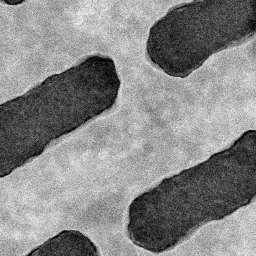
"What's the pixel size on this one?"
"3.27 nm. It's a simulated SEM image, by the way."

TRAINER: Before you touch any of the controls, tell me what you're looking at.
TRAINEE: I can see holes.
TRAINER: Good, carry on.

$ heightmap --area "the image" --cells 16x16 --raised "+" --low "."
+++++++++++.....
++++++++++......
+++++++++.......
++++++.++....+++
++++...+++..++++
++.....+++++++++
.......+++++++++
......++++++++++
....+++++++++++.
...+++++++++++..
.+++++++++++....
++++++++++......
++++++++........
++++++++......++
++++.+++....++++
++....+++..+++++